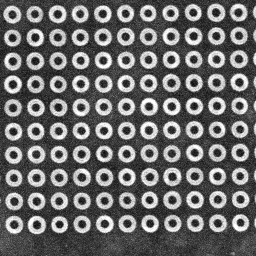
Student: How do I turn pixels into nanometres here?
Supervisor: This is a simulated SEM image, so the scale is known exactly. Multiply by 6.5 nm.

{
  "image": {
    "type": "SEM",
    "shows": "a regular array of ring-shaped raised bodies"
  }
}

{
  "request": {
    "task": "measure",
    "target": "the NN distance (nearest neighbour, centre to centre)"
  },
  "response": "146 nm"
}